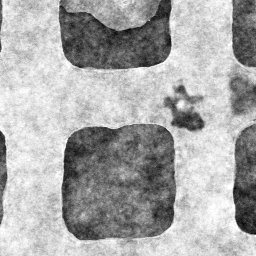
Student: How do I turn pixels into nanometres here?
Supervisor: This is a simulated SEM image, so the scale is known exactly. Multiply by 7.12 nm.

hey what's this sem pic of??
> holes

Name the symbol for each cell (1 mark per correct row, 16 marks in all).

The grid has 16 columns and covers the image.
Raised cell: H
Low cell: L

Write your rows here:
HHHHLLLLLLLHHHHL
HHHHLLLLLLLHHHLL
HHHHLLLLLLLHHHLL
HHHHLLLLLLHHHHHL
HHHHHHHHHHHHHHHH
HHHHHHHHHHHHHHHH
HHHHHHHHHHHHHHHH
HHHHHHHHHHHHHHHH
HHHHLLLLLLLHHHHL
HHHHLLLLLLLHHHHL
HHHHLLLLLLLHHHHL
HHHHLLLLLLLHHHHL
HHHHLLLLLLLHHHHL
HHHHLLLLLLLHHHHL
HHHHLLLLLLHHHHHL
HHHHHHHHHHHHHHHH